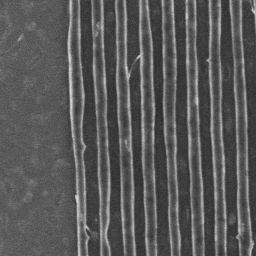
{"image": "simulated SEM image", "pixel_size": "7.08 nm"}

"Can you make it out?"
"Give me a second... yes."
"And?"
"parallel lines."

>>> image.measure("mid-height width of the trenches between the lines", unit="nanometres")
94.7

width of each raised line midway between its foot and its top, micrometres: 0.0699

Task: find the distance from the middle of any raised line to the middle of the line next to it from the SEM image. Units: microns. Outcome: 0.165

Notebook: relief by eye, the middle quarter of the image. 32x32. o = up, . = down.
..oo....oo...oo....ooo...ooo...o
..oo....oo...ooo...ooo...ooo...o
..oo....oo...ooo....oo...ooo...o
..oo....oo...ooo....oo...ooo...o
..oo....oo...ooo....oo...ooo...o
..ooo...oo...ooo....oo...ooo...o
..ooo...oo...ooo....oo...ooo...o
..ooo...oo...ooo....oo...ooo...o
..ooo...oo....oo....oo...ooo...o
..ooo...oo....oo....oo...ooo...o
..ooo...oo....oo....oo...ooo...o
..ooo...oo....oo....ooo..ooo...o
..ooo...oo....oo....ooo..ooo...o
..ooo...oo....oo....oo...ooo...o
..ooo...ooo...oo....oo...ooo...o
..oo....ooo...oo....oo...ooo...o
..oo....ooo...ooo...oo...ooo...o
..oo....ooo...oo....oo...ooo...o
..oo....ooo...ooo...oo...ooo...o
..ooo....oo...ooo...oo...ooo...o
...oo....oo...ooo...oo....oo....
...oo....oo...ooo...oo....oo...o
...oo....oo...ooo...oo....oo...o
...oo....oo...ooo...oo....oo...o
...oo....oo...ooo...oo....oo...o
...oo....oo...ooo...oo....oo...o
...oo....oo...ooo...oo....oo....
...oo....oo...ooo...oo....oo....
...oo....oo...ooo...oo....oo....
...oo....oo...ooo...oo....oo....
...oo....oo...ooo...ooo...oo....
...oo....oo....oo...ooo...oo....